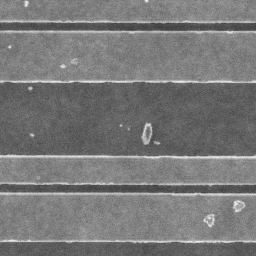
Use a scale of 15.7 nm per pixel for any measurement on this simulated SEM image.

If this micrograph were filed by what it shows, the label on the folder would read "lines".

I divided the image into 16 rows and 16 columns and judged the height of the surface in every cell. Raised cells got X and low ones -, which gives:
XXXXXXXXXXXXXXXX
XXXXXXXXXXXXXXXX
XXXXXXXXXXXXXXXX
XXXXXXXXXXXXXXXX
XXXXXXXXXXXXXXXX
----------------
----------------
----------------
----------------
----------------
XXXXXXXXXXXXXXXX
XXXXXXXXXXXXXXXX
XXXXXXXXXXXXXXXX
XXXXXXXXXXXXXXXX
XXXXXXXXXXXXXXXX
----------------